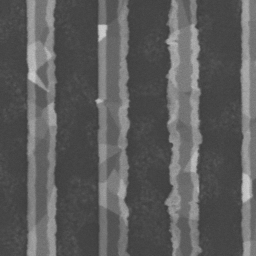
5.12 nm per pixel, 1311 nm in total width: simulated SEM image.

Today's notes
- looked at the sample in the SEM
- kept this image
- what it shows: one or a few lines or trenches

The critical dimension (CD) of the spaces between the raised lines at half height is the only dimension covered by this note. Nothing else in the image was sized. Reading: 0.263 micrometres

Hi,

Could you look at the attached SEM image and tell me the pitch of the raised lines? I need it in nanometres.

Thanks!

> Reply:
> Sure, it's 365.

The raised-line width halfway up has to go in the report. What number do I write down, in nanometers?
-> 102